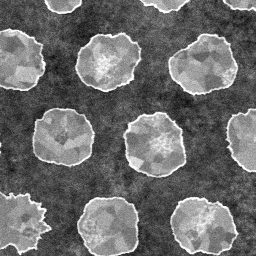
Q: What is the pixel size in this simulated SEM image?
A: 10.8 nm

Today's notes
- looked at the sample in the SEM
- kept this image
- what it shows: raised bodies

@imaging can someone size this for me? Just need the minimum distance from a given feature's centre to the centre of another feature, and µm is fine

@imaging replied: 0.97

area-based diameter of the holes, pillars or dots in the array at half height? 653 nm